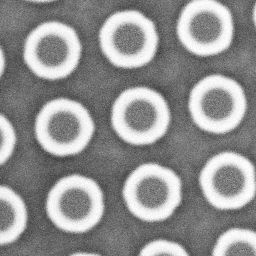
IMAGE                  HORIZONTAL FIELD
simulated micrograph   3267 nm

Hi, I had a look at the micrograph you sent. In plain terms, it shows an array of small figures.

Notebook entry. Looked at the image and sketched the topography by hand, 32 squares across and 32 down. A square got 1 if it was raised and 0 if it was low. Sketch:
00000000000000000000000011100000
00000000000000001000000111111000
00000000000000111100001111111000
00000111100001111110001111111000
00001111100001111111001111111000
00011111110001111111000111111000
00011111110001111110000011100000
00011111110000111110000000000000
00001111100000000000000000000000
00000111000000000000000000000000
00000000000000000000000001111100
00000000000000001110000011111100
00000001000000011111000011111110
00000011110000111111100011111110
00000111111000111111100011111100
10000111111100111111100001111100
11000111111000011111000000010000
11000111111000001110000000000000
11000011110000000000000000000000
10000000000000000000000000011100
00000000000000000000000000111110
00000000000000000111100001111111
00000000111000001111110001111111
10000001111100001111110001111111
11000011111110001111110000111111
11100011111110001111110000011100
11100011111110000111100000000000
11100001111100000000000000000000
11100000111000000000000000000000
11000000000000000000000000001111
00000000000000000001110000011111
00000000000000000011111000011111